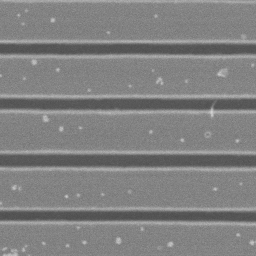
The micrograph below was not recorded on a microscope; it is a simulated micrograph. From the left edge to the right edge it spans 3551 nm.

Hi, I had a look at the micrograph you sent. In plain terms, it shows lines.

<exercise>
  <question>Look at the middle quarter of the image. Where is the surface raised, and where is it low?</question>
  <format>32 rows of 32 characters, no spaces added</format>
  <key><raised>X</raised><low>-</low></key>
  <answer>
XXXXXXXXXXXXXXXXXXXXXXXXXXXXXXXX
XXXXXXXXXXXXXXXXXXXXXXXXXXXXXXXX
XXXXXXXXXXXXXXXXXXXXXXXXXXXXXXXX
XXXXXXXXXXXXXXXXXXXXXXXXXXXXXXXX
XXXXXXXXXXXXXXXXXXXXXXXXXXXXXXXX
XXXXXXXXXXXXXXXXXXXXXXXXXXXXXXXX
XXXXXXXXXXXXXXXXXXXXXXXXXXXXXXXX
XXXXXXXXXXXXXXXXXXXXXXXXXXXXXXXX
XXXXXXXXXXXXXX----XXXXXXXXXXXXXX
--------------------------------
--------------------------------
XXX---------------------XXXXXXX-
XXXXXXXXXXXXXXXXXXXXXXXXXXXXXXXX
XXXXXXXXXXXXXXXXXXXXXXXXXXXXXXXX
XXXXXXXXXXXXXXXXXXXXXXXXXXXXXXXX
XXXXXXXXXXXXXXXXXXXXXXXXXXXXXXXX
XXXXXXXXXXXXXXXXXXXXXXXXXXXXXXXX
XXXXXXXXXXXXXXXXXXXXXXXXXXXXXXXX
XXXXXXXXXXXXXXXXXXXXXXXXXXXXXXXX
XXXXXXXXXXXXXXXXXXXXXXXXXXXXXXXX
XXXXXXXXXXXXXXXXXXXXXXXXXXXXXXXX
XXXXXXXXXXXXXXXXXXXXXXXXXXXXXXXX
---------------XXXXXXXXX------XX
--------------------------------
--------------------------------
--------------------------------
XXXXXXXXXXXXXXXXXXXXXXXXXXXXXXXX
XXXXXXXXXXXXXXXXXXXXXXXXXXXXXXXX
XXXXXXXXXXXXXXXXXXXXXXXXXXXXXXXX
XXXXXXXXXXXXXXXXXXXXXXXXXXXXXXXX
XXXXXXXXXXXXXXXXXXXXXXXXXXXXXXXX
XXXXXXXXXXXXXXXXXXXXXXXXXXXXXXXX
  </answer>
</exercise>